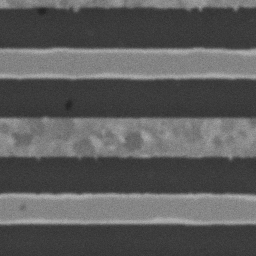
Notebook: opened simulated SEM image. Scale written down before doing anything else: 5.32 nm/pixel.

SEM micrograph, lines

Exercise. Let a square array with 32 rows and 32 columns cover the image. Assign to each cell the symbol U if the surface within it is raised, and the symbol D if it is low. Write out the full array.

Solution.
UUUUUUUUUUUUUUUUUUUUUUUUUUUUUUUU
DDDDDDDDDDDDDDDDDDDDDDDDDDDDDDDD
DDDDDDDDDDDDDDDDDDDDDDDDDDDDDDDD
DDDDDDDDDDDDDDDDDDDDDDDDDDDDDDDD
DDDDDDDDDDDDDDDDDDDDDDDDDDDDDDDD
DDDDDDDDDDDDDDDDDDDDDDDDDDDDDDDD
UUUUUUUUUUUUUUUUUUUUUUUUUUUUUDDD
UUUUUUUUUUUUUUUUUUUUUUUUUUUUUUUU
UUUUUUUUUUUUUUUUUUUUUUUUUUUUUUUU
DUUUDDDUUUUUDDDDUUUUUUUUDDDDUUUU
DDDDDDDDDDDDDDDDDDDDDDDDDDDDDDDD
DDDDDDDDDDDDDDDDDDDDDDDDDDDDDDDD
DDDDDDDDDDDDDDDDDDDDDDDDDDDDDDDD
DDDDDDDDDDDDDDDDDDDDDDDDDDDDDDDD
DDDDDDDDDDDDDDDDDDDDDDDDDDDDDDDD
UUUUUUUUUUUUUUUUUUUUUUUUUUUUUUUU
UUUUUUUUUUUUUUUUUUUUUUUUUUUUUUUU
UUUUUUUUUUUUUUUUUUUUUUUUUUUUUUUU
UUUUUUUUUUUUUUUUUUUUUUUUUUUUUUUU
DDDDDDDDDDDDDDDUUUUDDDDUUUDDDDUD
DDDDDDDDDDDDDDDDDDDDDDDDDDDDDDDD
DDDDDDDDDDDDDDDDDDDDDDDDDDDDDDDD
DDDDDDDDDDDDDDDDDDDDDDDDDDDDDDDD
DDDDDDDDDDDDDDDDDDDDDDDDDDDDDDDD
UUUUUUUDUDUUUUUUUUUUUUUUUUUUUUDD
UUUUUUUUUUUUUUUUUUUUUUUUUUUUUUUU
UUUUUUUUUUUUUUUUUUUUUUUUUUUUUUUU
UUUUUUUUUUUUUUUUUUUUUUUUUUUUUUUU
DDDDDDDDDDDDDDDDDDDDDDDDDDDDDDDD
DDDDDDDDDDDDDDDDDDDDDDDDDDDDDDDD
DDDDDDDDDDDDDDDDDDDDDDDDDDDDDDDD
DDDDDDDDDDDDDDDDDDDDDDDDDDDDDDDD